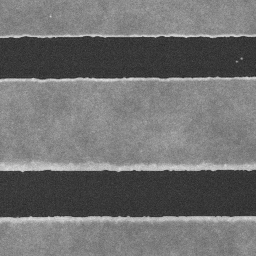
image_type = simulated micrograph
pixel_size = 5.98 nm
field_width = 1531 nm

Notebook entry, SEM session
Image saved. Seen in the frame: lines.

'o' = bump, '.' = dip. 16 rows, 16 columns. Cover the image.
oooooooooooooooo
oooooooooooooooo
................
................
................
oooooooooooooooo
oooooooooooooooo
oooooooooooooooo
oooooooooooooooo
oooooooooooooooo
oooooooooooooooo
................
................
................
oooooooooooooooo
oooooooooooooooo